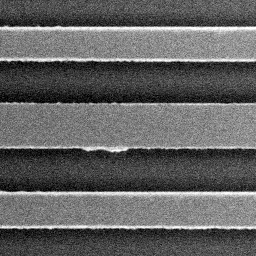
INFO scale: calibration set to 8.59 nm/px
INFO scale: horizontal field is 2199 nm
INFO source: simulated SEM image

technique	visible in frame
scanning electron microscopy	lines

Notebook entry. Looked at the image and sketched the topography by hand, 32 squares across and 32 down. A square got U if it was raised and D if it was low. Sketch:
DDDDDDDDDDDDDDDDDDDDDDDDDDDDDDDD
DDDDDDDDDDDDDDDDDDDDDDDDDDDDDDDD
DDDDDDDDDDDDDDDDDDDDDDDDDDDDDDDD
UUUUUUUUUUUUUUUUUUUUUUUUDUUUUUUU
UUUUUUUUUUUUUUUUUUUUUUUUUUUUUUUU
UUUUUUUUUUUUUUUUUUUUUUUUUUUUUUUU
UUUUUUUUUUUUUUUUUUUUUUUUUUUUUUUU
UUUUUUUUUUUUUUUUUUUUUUUUUUUUUUUU
DDDDDDDDDDDDDDDDDDDDDDDDDDDDDDDD
DDDDDDDDDDDDDDDDDDDDDDDDDDDDDDDD
DDDDDDDDDDDDDDDDDDDDDDDDDDDDDDDD
DDDDDDDDDDDDDDDDDDDDDDDDDDDDDDDD
DDDDDDDDDDDDDDDDDDDDDDDDDDDDDDDD
UUUUUUUUUUUUUUUUUUUUUUUUUUUUUUUU
UUUUUUUUUUUUUUUUUUUUUUUUUUUUUUUU
UUUUUUUUUUUUUUUUUUUUUUUUUUUUUUUU
UUUUUUUUUUUUUUUUUUUUUUUUUUUUUUUU
UUUUUUUUUUUUUUUUUUUUUUUUUUUUUUUU
DDDDDDDDDDDDDUDDDDDDUDDDDUDDDDDD
DDDDDDDDDDDDDDDDDDDDDDDDDDDDDDDD
DDDDDDDDDDDDDDDDDDDDDDDDDDDDDDDD
DDDDDDDDDDDDDDDDDDDDDDDDDDDDDDDD
DDDDDDDDDDDDDDDDDDDDDDDDDDDDDDDD
DDDDDDDDDDDDDDDDDDDDDDDDDDDDDDDD
UUUUUUUUUUUUUUUUUUUUUUUUUUUUUUUU
UUUUUUUUUUUUUUUUUUUUUUUUUUUUUUUU
UUUUUUUUUUUUUUUUUUUUUUUUUUUUUUUU
UUUUUUUUUUUUUUUUUUUUUUUUUUUUUUUU
DDDDDDDDDDDDDDDDDDDDDUDDDDDDDDDD
DDDDDDDDDDDDDDDDDDDDDDDDDDDDDDDD
DDDDDDDDDDDDDDDDDDDDDDDDDDDDDDDD
DDDDDDDDDDDDDDDDDDDDDDDDDDDDDDDD